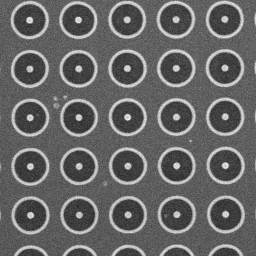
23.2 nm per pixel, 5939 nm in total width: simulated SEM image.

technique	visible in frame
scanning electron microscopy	an array of small figures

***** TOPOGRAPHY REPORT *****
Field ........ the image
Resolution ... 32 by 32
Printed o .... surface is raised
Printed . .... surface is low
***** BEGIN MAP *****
ooo.ooooo.ooooo..oooo..oooo..ooo
oo....oo....oo....oo....oo....oo
oo....oo....oo....oo....oo....oo
oo....oo....oo....oo....oo....oo
ooo.ooooo..oooo..oooo..ooooooooo
oooooooooooooooooooooooooooooooo
ooo.ooooooooooooooooo..oooo..ooo
oo....oo....oo....oo....oo....oo
oo....oo....oo....oo....oo....oo
oo....oo....oo....oo....oo....oo
ooo..oooo..oooo..oooo..oooo..ooo
oooooooooooooooooooooooooooooooo
oooooooooooooooooooooooooooooooo
oo....oo....oo....oo....oo....oo
oo....oo....oo....oo....oo....oo
oo....oo....oo....oo....oo....oo
ooo..oooo..oooo..oooo..oooo..ooo
oooooooooooooooooooooooooooooooo
oooooooooooooooooooooooooooooooo
oo...ooo....oo....oo....oo....oo
oo....oo....oo....oo....oo....oo
oo....oo....oo....oo....oo....oo
oo...oooo..oooo..oooo..oooo..ooo
oooooooooooooooooooooooooooooooo
oooooooooooooooooooooooooooooooo
oo...ooo....oo....oo....ooo...oo
oo....oo....oo....oo....oo....oo
oo....oo....oo....oo....oo....oo
oo...ooo...oooo..oooo..oooo...oo
oooooooooooooooooooooooooooooooo
oooooooooooooooooooooooooooooooo
oo...ooo...oooo...ooo...ooo...oo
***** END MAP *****